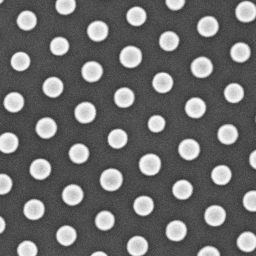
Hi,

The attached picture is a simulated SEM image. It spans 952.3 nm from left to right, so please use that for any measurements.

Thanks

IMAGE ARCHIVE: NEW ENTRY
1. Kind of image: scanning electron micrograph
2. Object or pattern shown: a regular array of raised bodies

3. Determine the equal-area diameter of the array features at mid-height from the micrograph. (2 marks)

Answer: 69.9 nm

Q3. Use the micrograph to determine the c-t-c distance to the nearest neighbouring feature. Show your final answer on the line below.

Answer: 153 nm